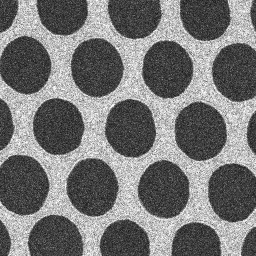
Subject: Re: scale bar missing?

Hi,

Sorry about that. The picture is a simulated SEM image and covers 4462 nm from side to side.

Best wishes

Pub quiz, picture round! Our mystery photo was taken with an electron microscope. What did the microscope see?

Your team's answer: holes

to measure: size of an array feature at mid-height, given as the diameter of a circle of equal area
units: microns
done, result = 0.96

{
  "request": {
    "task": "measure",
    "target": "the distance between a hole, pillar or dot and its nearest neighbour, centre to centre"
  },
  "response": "1.21 µm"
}